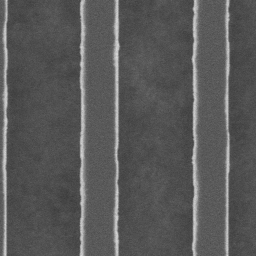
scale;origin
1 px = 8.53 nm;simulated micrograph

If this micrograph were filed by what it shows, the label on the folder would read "lines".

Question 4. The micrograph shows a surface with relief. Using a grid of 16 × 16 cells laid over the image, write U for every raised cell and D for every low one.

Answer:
DDDDDUUDDDDDUUDD
DDDDDUUDDDDDUUDD
DDDDDUUDDDDDUUDD
DDDDDUUDDDDDUUDD
DDDDDUUDDDDDUUDD
DDDDDUUDDDDDUUDD
DDDDDUUDDDDDUUDD
DDDDDUUDDDDDUUDD
DDDDDUUDDDDDUUDD
DDDDDUUDDDDDUUDD
DDDDDUUDDDDDUUDD
DDDDDUUDDDDDUUDD
DDDDDUUDDDDDUUDD
DDDDDUUDDDDDUUDD
DDDDDUUDDDDDUUDD
DDDDDUUDDDDDUUDD